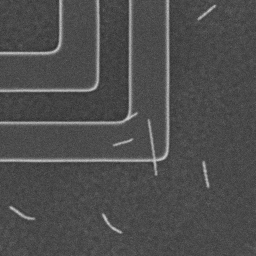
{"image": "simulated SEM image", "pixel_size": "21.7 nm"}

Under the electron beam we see groups of lines, slits or small figures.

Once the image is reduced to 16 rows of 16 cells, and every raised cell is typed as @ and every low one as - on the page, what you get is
----@@--@@------
----@@--@@------
----@@--@@------
@@@@@@--@@@-----
@@@@@@--@@@-----
@@@@@@--@@@-----
--------@@------
--------@@@-----
@@@@@@@@@@@-----
@@@@@@@@@@------
----------------
----------------
----------------
----------------
----------------
----------------